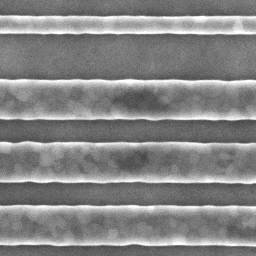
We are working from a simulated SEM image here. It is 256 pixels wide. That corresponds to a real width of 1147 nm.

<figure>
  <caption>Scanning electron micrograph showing wiring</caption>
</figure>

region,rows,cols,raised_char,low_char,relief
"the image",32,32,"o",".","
................................
................................
oooooooooooooooooooooooooooooooo
oooooooooooooooooooooooooooooooo
................................
................................
................................
................................
................................
................................
oooooooooooooooooooooooooooooooo
oooooooooooooooooooooooooooooooo
oooooooooooooooooooooooooooooooo
oooooooooooooooooooooooooooooooo
oooooooooooooooooooooooooooooooo
................................
................................
................................
oooooooooooooooooooooooooooooooo
oooooooooooooooooooooooooooooooo
oooooooooooooooooooooooooooooooo
oooooooooooooooooooooooooooooooo
oooooooooooooooooooooooooooooooo
................................
................................
................................
oooooooooooooooooooooooooooooooo
oooooooooooooooooooooooooooooooo
oooooooooooooooooooooooooooooooo
oooooooooooooooooooooooooooooooo
oooooooooooooooooooooooooooooooo
................................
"